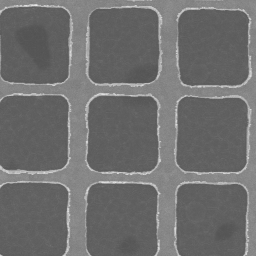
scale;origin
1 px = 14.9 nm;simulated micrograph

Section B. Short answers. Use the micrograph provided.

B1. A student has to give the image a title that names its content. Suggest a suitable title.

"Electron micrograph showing holes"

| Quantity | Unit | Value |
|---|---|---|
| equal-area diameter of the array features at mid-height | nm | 1210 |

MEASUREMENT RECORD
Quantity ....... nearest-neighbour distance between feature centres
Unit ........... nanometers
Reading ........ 1310